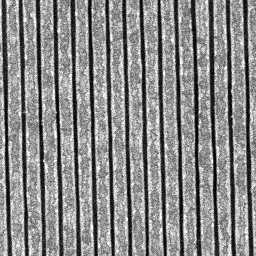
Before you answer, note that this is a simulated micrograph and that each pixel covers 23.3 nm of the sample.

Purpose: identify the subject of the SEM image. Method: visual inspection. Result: parallel lines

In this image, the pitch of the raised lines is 402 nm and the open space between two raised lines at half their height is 108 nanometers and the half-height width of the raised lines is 297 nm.